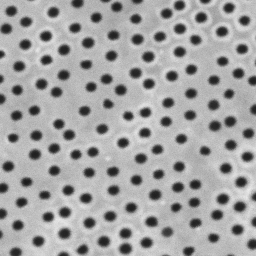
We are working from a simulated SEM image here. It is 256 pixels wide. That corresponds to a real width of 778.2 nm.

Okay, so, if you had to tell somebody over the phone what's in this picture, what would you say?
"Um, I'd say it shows a regular array of holes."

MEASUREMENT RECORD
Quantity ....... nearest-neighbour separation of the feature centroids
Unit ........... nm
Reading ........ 61.2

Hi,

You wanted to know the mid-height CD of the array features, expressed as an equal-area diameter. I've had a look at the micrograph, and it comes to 31.9 nanometres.